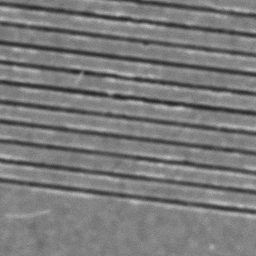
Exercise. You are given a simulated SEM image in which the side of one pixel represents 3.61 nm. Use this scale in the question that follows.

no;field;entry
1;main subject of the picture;parallel lines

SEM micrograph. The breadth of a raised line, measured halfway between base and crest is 46.1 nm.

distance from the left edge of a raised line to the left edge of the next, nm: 70.2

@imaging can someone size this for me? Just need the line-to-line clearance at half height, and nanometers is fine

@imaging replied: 24.6